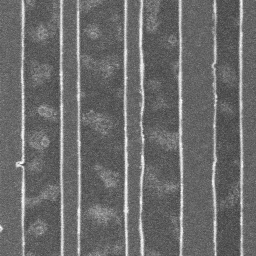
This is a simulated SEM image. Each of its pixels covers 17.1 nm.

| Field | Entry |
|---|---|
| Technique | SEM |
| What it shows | one or a few lines or trenches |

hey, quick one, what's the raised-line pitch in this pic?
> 1.09 µm